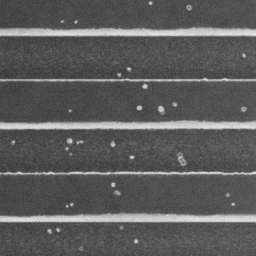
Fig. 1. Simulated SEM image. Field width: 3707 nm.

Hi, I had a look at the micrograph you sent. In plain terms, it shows lines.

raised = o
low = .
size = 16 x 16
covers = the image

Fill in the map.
oooooooooooooooo
oooooooooooooooo
................
................
................
oooooooooooooooo
oooooooooooooooo
oooooooooooooooo
................
................
................
oooooooooooooooo
oooooooooooooooo
oooooooooooooooo
................
................